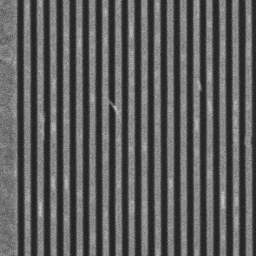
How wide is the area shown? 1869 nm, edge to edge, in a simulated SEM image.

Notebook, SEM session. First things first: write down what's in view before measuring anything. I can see parallel lines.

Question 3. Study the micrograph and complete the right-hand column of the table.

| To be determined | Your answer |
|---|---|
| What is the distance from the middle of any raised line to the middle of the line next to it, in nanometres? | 95.1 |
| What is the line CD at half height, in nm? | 47.4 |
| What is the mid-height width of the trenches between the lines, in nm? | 47.4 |